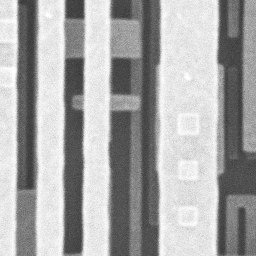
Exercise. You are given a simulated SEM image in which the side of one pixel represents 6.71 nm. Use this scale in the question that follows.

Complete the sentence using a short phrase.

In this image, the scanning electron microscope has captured wiring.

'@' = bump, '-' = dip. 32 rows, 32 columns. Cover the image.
@@---@@@---@@@------@@@@@@@-----
@@---@@@---@@@------@@@@@@@-----
@@---@@@---@@@------@@@@@@@-----
@@---@@@---@@@------@@@@@@@-----
@@---@@@---@@@------@@@@@@@-----
@@---@@@---@@@------@@@@@@@-----
@@---@@@---@@@------@@@@@@@-----
@@---@@@---@@@------@@@@@@@-----
@@---@@@---@@@------@@@@@@@-----
@@---@@@---@@@------@@@@@@@-----
@@---@@@---@@@------@@@@@@@-----
@@---@@@---@@@------@@@@@@@-----
@@---@@@---@@@------@@@@@@@-----
@@---@@@---@@@------@@@@@@@-----
@@---@@@---@@@------@@@@@@@-----
@@---@@@---@@@------@@@@@@@-----
@@---@@@---@@@------@@@@@@@-----
@@---@@@---@@-------@@@@@@@-----
@@---@@@---@@-------@@@@@@@-----
@@---@@@---@@@------@@@@@@@-----
@@---@@@---@@@------@@@@@@@-----
@@---@@@---@@@------@@@@@@@-----
@@---@@@---@@@------@@@@@@@-----
@@---@@@---@@-------@@@@@@@-----
@@---@@@---@@-------@@@@@@@-----
@@---@@@--@@@-------@@@@@@@-----
@@---@@@--@@@-------@@@@@@@-----
@@---@@@---@@-------@@@@@@@-----
@@---@@@---@@-------@@@@@@@-----
@@---@@@---@@-------@@@@@@@-----
@@---@@@---@@-------@@@@@@@-----
@@---@@@--@@@-------@@@@@@@-----